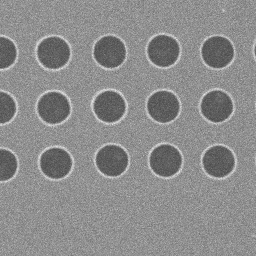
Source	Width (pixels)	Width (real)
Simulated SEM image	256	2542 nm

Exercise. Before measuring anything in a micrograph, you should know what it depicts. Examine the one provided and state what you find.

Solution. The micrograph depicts a regular array of holes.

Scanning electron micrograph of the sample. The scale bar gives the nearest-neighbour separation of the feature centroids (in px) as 53.7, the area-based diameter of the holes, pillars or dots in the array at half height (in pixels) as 32.9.